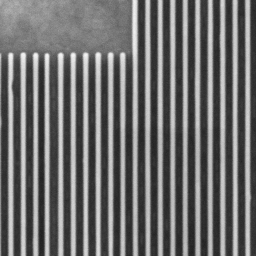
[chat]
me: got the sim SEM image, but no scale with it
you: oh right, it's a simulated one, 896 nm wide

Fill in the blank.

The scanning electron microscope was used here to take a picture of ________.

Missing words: parallel lines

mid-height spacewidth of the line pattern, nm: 27.1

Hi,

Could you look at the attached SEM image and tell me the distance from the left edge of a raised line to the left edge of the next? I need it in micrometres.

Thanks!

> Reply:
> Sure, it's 0.0437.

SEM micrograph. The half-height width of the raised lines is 17.9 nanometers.